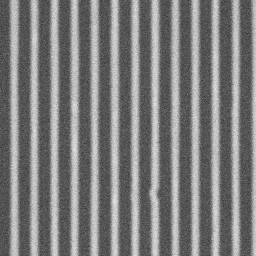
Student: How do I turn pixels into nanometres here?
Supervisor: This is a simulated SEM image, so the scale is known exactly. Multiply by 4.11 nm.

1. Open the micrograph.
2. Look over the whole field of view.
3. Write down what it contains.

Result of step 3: parallel lines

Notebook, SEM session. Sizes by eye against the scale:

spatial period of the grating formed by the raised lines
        20.1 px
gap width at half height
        58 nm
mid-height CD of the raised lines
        23.6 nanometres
